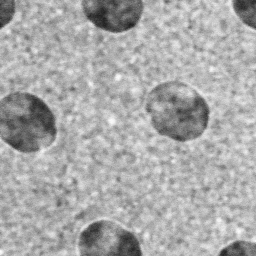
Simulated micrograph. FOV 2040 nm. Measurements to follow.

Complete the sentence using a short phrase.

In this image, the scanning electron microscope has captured holes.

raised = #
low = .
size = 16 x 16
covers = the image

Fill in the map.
.####....######.
.#####...######.
################
################
################
##########..####
...######....###
...######....###
....######...###
#.##############
################
################
################
################
#####...########
#####....#####..